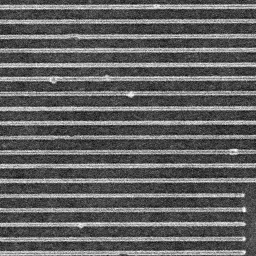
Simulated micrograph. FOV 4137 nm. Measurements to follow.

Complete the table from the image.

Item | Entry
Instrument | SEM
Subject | parallel lines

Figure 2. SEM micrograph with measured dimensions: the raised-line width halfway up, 0.0424 µm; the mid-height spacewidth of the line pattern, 0.188 um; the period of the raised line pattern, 234 nm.